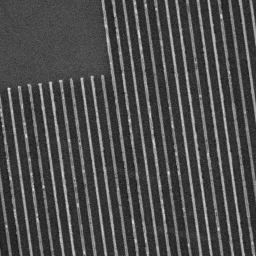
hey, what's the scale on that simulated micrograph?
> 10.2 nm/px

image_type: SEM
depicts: parallel lines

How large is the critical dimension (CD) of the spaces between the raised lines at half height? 86.9 nm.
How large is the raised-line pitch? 107 nm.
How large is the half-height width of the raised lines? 17.6 nanometres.